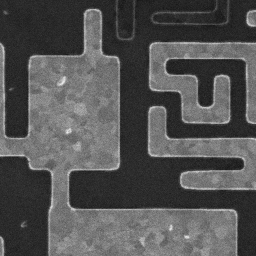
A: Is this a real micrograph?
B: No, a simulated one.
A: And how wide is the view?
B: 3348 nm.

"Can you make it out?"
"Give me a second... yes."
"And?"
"wiring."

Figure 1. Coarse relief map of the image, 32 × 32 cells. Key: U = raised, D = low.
DDDDDDDDDDDDDDDUUDDDDDDDDDDUDDDD
DDDDDDDDDDDUDDDUUDDDDDDDDDUUDDDU
DDDDDDDDDDDUUDDUUDDUUUUUUUUUDDDU
DDDDDDDDDDDUUDDUUDDDDDDDDDDDDDDD
DDDDDDDDDDDUUDDUUDDDDDDDDDDDDDDD
DDDDDDDDDDDUUDDDDDDUUUUUUUUUUUUU
DDDDDDDDDDUUUDDDDDDUUUUUUUUUUUUU
DDDDUUUUUUUUUUUDDDDUUDDDDDDDDDUU
DDDDUUUUUUUUUUUDDDDUUDDDDDDDDDDU
DDDDUUUUUUUUUUUDDDDUUUUUDDDUDDDU
DDDDUUUUUUUUUUUDDDDUUUUUUDDUUDDU
UDDDUUUUUUUUUUUDDDDDDDUUUDDUUDDU
UDDDUUUUUUUUUUUDDDDDDDDUUDDUUDDU
UDDDUUUUUUUUUUUDDDDUDDDUUUUUUDDU
UDDDUUUUUUUUUUUDDDDUUDDUUUUUUDDU
UDDDUUUUUUUUUUUDDDDUUDDDDDDDDDDD
UDDDUUUUUUUUUUUDDDDUUDDDDDDDDDDD
UUUUUUUUUUUUUUUDDDDUUUUUUUUUUUUU
UUUUUUUUUUUUUUUDDDDUUUUUUUUUUUUU
DDDUUUUUUUUUUUUDDDDDDDDDDUUUUUUU
DDDDUUUUUUUUUUUDDDDDDDDDDDDDDDUU
DDDDDDUUUDDDDDDDDDDDDDDUUUUUUUUU
DDDDDDDUUDDDDDDDDDDDDDDUUUUUUUUU
DDDDDDDUUDDDDDDDDDDDDDDUUUUUUUUU
DDDDDDUUUDDDDDDDDDDDDDDDDDDDDDDD
DDDDDDUUUDDDDDDDDDDDDDDDDDDDDDDD
DDDDDDUUUUUUUUUUUUUUUUUUUUUUUDDD
DDDDDDUUUUUUUUUUUUUUUUUUUUUUUUDD
DDDDDDUUUUUUUUUUUUUUUUUUUUUUUUDD
DDDDDDUUUUUUUUUUUUUUUUUUUUUUUUDD
DDDDDDUUUUUUUUUUUUUUUUUUUUUUUUDD
DDDDDDUUUUUUUUUUUUUUUUUUUUUUUUDD